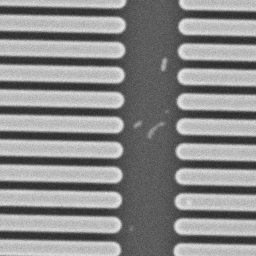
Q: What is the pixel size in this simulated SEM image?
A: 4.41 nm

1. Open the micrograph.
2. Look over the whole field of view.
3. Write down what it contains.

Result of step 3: groups of lines, slits or small figures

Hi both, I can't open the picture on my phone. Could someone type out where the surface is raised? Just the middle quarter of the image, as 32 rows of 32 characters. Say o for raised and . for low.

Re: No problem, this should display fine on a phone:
................................
ooooooooooooooo..............ooo
ooooooooooooooo..............ooo
ooooooooooooooo.............oooo
......oooooooo...............ooo
................................
................................
oooooooooooooo..................
ooooooooooooooo..............ooo
ooooooooooooooo.............oooo
oooooooooooooo...............ooo
................................
................................
ooooooooooooo...................
ooooooooooooooo..............ooo
ooooooooooooooo.............oooo
oooooooooooooo..............oooo
.............................ooo
................................
oooooooo........................
oooooooooooooo...............ooo
ooooooooooooooo.............oooo
oooooooooooooo..............oooo
.............................ooo
................................
................................
oooooooooooooo...............ooo
oooooooooooooo..............oooo
oooooooooooooo..............oooo
..........ooo...............oooo
................................
................................